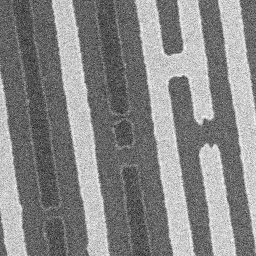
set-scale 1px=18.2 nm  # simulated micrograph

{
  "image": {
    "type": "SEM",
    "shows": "parallel lines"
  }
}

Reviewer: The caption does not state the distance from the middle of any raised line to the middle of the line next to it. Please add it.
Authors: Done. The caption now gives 41 px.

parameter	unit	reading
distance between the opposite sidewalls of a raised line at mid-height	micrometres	0.34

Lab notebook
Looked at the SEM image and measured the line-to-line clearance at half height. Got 22.3 pixels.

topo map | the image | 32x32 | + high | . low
.+++...++...++...++...+++..+++..
..++...++...+++..+++...++...++..
..++...++...+++..+++...++...++..
..++...+++..+++...++...++...++..
..++...+++..+++...++...++...++..
..++...+++...++...++...++...+++.
..+++...++...++...++...+++..+++.
...++...++...++...++++++++..+++.
...++...++...+++..++++++++...++.
...++...++...+++..++++.+++...++.
...++...+++..+++...++...++...++.
...++...+++..+++...++...++...++.
+..+++..+++...++...++...++...+++
+..+++..+++...++...++...++...+++
+...++...++........++...+++...++
+...++...++...++...+++........++
+...++...+++..+++..+++........++
+...++...+++..+++...++........++
+...+++..+++........++...++...++
+...+++..+++........++...++...++
++..+++...++........++...+++..++
++...++...++...++...+++..+++...+
++...++...++...++...+++...++...+
++...++...++...+++..+++...++...+
++...++...+++...++...++...++...+
++...++...+++...++...++...++...+
+++........++...++...++...+++..+
+++...++...++...++...++...+++...
+++...++...++...++...+++..+++...
.++...++...++...+++..+++..+++...
.++...++...++...+++...++...++...
.++...++...++...+++...++...++...